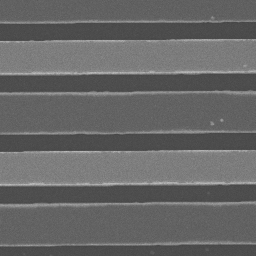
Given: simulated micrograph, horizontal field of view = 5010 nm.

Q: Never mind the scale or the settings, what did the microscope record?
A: lines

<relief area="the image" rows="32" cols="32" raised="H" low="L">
HHHHHHHHHHHHHHHHHHHHHHHHHHHHHHHH
HHHHHHHHHHHHHHHHHHHHHHHHHHHHHHHH
HHHHHHHHHHHHHHHHHHHHHHHHHHHHHHHH
LLLLLLLLLLLLLLLLLLLLLLLLLLLLLLLL
LLLLLLLLLLLLLLLLLLLLLLLLLLLLLLLL
HHHHHHHHHHHHHHHHHHHHHHHHHHHHHHHH
HHHHHHHHHHHHHHHHHHHHHHHHHHHHHHHH
HHHHHHHHHHHHHHHHHHHHHHHHHHHHHHHH
HHHHHHHHHHHHHHHHHHHHHHHHHHHHHHHH
LLLLLLLLLLLLLLLLLLLLLLLLLLLLLLLL
LLLLLLLLLLLLLLLLLLLLLLLLLLLLLLLL
LLLLLLLLLLLLLLLLLLHHHHHHHHHHHHHH
HHHHHHHHHHHHHHHHHHHHHHHHHHHHHHHH
HHHHHHHHHHHHHHHHHHHHHHHHHHHHHHHH
HHHHHHHHHHHHHHHHHHHHHHHHHHHHHHHH
HHHHHHHHHHHHHHHHHHHHHHHHHHHHHHHH
HHHHHHHHHHHHHHHHHHHHHHHHHHHHHHHH
LLLLLLLLLLLLLLLLLLLLLLLLLLLLLLLL
LLLLLLLLLLLLLLLLLLLLLLLLLLLLLLLL
HHHHHHHHHHHHHHHHHHHHHHHHHHHHHHHH
HHHHHHHHHHHHHHHHHHHHHHHHHHHHHHHH
HHHHHHHHHHHHHHHHHHHHHHHHHHHHHHHH
HHHHHHHHHHHHHHHHHHHHHHHHHHHHHHHH
LLLLLLLLLLLLLLLLLLLLLLLLLLLLLLLL
LLLLLLLLLLLLLLLLLLLLLLLLLLLLLLLL
LLLLLLLHHHHHHHHHHHHHHHHHHHHHHHHH
HHHHHHHHHHHHHHHHHHHHHHHHHHHHHHHH
HHHHHHHHHHHHHHHHHHHHHHHHHHHHHHHH
HHHHHHHHHHHHHHHHHHHHHHHHHHHHHHHH
HHHHHHHHHHHHHHHHHHHHHHHHHHHHHHHH
HHHHHHHHHHHHHHHHHHHHHHHLLLLLLLLL
LLLLLLLLLLLLLLLLLLLLLLLLLLLLLLLL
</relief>